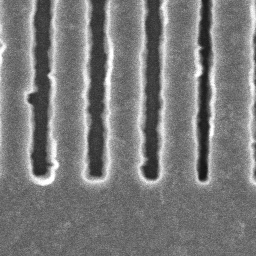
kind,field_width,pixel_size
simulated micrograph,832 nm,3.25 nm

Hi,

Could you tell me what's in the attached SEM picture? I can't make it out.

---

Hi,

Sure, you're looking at parallel lines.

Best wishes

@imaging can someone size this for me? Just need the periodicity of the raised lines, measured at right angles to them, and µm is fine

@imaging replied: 0.176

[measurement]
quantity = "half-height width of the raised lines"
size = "123 nm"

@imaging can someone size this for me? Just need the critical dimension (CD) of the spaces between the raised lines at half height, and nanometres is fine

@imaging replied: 56.8